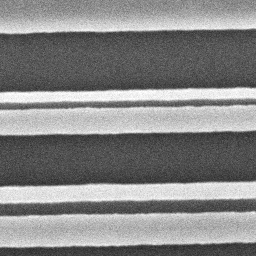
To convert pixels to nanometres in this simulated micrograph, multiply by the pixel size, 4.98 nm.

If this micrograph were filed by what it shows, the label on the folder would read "lines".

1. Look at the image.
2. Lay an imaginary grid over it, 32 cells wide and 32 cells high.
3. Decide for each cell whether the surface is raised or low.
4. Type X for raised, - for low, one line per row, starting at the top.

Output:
XXXXXXXXXXXXXXXXXXXXXXXXXXXXXXXX
XXXXXXXXXXXXXXXXXXXXXXXXXXXXXXXX
XXXXXXXXXXXXXXXXXXXXXXXXXXXXXXXX
XXXXXXXXXXXXXXXXXXXXXXXXXXXX----
--------------------------------
--------------------------------
--------------------------------
--------------------------------
--------------------------------
--------------------------------
--------------------------------
-----------XXXXXXXXXXXXXXXXXXXXX
XXXXXXXXXXXXXXXXXXXXXXXXXXXXXXXX
XXXXXXXXXXXXXXXXXXXXXXXXXXXXXXXX
XXXXXXXXXXXXXXXXXXXXXXXXXXXXXXXX
XXXXXXXXXXXXXXXXXXXXXXXXXXXXXXXX
XXXXXXXXXXXXXXXXXXX-------------
--------------------------------
--------------------------------
--------------------------------
--------------------------------
--------------------------------
--------------------------------
XXXXXXXXXXXXXXXXXXXXXXXXXXXXXXXX
XXXXXXXXXXXXXXXXXXXXXXXXXXXXXXXX
XXXXXXXXXXXXXXXXXXXXXXXXXXXXXXXX
XXXXXXXXXXXXXXXXXXXXXXXXXXXXXXXX
XXXXXXXXXXXXXXXXXXXXXXXXXXXXXXXX
XXXXXXXXXXXXXXXXXXXXXXXXXXXXXXXX
XXXXXXXXXXXXXXXXXXXXXXXXXXXXXXXX
XXXXXXXXXXXXXXXXX--X------------
--------------------------------